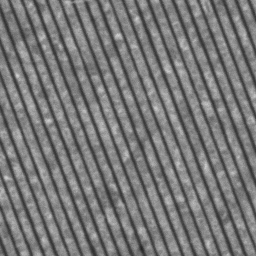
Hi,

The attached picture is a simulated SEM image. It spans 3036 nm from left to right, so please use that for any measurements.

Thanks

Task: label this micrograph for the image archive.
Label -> parallel lines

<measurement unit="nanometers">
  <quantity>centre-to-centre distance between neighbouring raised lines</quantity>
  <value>140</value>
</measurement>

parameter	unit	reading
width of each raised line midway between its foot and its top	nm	92.8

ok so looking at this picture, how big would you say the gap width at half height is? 4.08 pixels